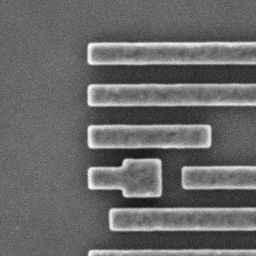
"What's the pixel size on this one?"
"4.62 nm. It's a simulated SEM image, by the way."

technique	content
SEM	wiring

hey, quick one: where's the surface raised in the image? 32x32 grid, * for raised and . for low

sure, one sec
................................
................................
................................
................................
................................
...........*********************
...........*********************
...........*********************
................................
................................
................................
...........*********************
...........*********************
................................
................................
................................
...........***************......
...........***************......
................................
................................
...............*****............
...........*********...*********
...........*********...*********
...........*********...****.****
................****............
................................
..............******************
..............******************
..............******************
................................
................................
...........*********************